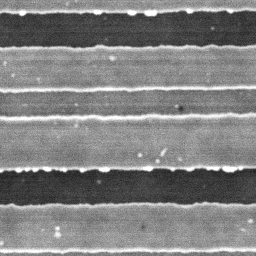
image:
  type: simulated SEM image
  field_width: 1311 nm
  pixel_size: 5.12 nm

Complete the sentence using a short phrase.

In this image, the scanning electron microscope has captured lines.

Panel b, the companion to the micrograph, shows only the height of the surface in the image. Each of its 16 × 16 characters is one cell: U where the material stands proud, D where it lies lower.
UUUUUUUUUUUUUUUU
DDDDDDDDDDDDDDDD
DDDDDDDDDDDDDDDD
UUUUUUUUUUUUUUUU
UUUUUUUUUUUUUUUU
UUUUUUUUUUUUUUUU
UUUUUUUUUUUUUUUU
UUUUUUUUUUUUUUUU
UUUUUUUUUUUUUUUU
UUUUUUUUUUUUUUUU
UUUUUUUUUUUUUUUU
DDDDDDDDDDDDDDDD
DDDDDDDDDDDDDDDD
UUUUUUUUUUUUUUUU
UUUUUUUUUUUUUUUU
UUUUUUUUUUUUUUUU